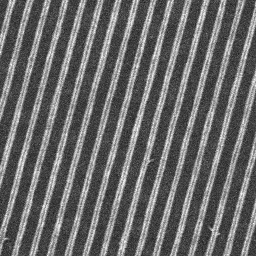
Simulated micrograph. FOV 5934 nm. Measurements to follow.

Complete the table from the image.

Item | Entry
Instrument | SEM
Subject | parallel lines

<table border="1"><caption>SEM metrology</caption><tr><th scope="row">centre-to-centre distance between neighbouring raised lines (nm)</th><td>395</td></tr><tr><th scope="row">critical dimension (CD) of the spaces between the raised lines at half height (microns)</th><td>0.28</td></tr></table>